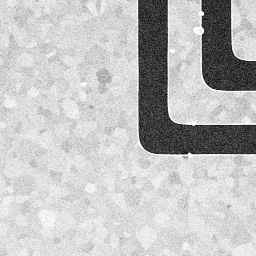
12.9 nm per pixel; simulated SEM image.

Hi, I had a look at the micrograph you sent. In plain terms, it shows groups of lines, slits or small figures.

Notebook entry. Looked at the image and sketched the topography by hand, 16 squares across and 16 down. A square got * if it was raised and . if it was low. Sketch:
*********..**..*
*********..**..*
*********..**..*
*********..**..*
*********..**...
*********..**...
*********..*****
*********..*****
*********.......
*********.......
****************
****************
****************
****************
****************
****************